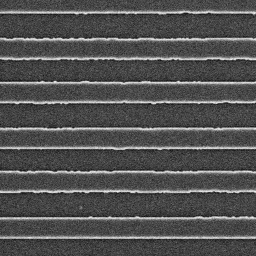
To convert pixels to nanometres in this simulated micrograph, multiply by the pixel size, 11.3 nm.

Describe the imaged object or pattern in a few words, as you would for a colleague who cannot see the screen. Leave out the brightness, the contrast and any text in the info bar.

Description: lines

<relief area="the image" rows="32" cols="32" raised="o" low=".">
oooooooooooooooooooooooooooooooo
oooooooooooooooooooooooooooooooo
................................
................................
................................
oooooooooooooooooooooooooooooooo
oooooooooooooooooooooooooooooooo
................................
................................
................................
oooooooooooooooooooooooooooooooo
oooooooooooooooooooooooooooooooo
oooooooooooooooooooooooooooooooo
................................
................................
................................
oooooooooooooooooooooooooooooooo
oooooooooooooooooooooooooooooooo
oooooooooooooooooooooooooooooooo
................................
................................
oooooooooo.ooooooooooooooooooooo
oooooooooooooooooooooooooooooooo
oooooooooooooooooooooooooooooooo
................................
................................
................................
oooooooooooooooooooooooooooooooo
oooooooooooooooooooooooooooooooo
oooooooooooooooooooooooooooooooo
................................
................................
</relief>